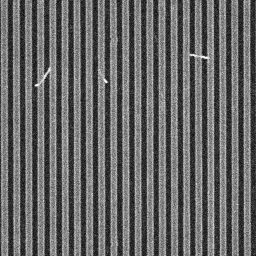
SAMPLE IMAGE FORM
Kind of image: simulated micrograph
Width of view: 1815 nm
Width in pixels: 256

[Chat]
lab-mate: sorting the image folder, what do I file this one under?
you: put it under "parallel lines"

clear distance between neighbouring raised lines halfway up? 45.2 nm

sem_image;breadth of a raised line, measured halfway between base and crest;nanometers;39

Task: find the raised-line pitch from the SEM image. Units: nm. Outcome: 86.1